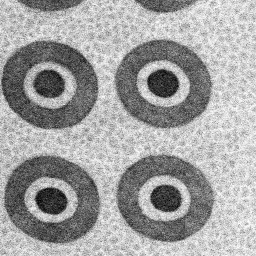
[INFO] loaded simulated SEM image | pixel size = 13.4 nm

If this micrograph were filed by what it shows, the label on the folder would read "ring-shaped grooves with a dot in the middle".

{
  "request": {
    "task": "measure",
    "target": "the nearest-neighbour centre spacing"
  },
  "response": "1520 nm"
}